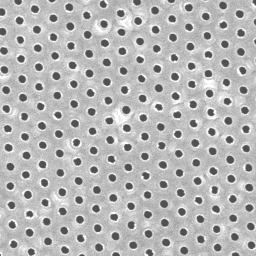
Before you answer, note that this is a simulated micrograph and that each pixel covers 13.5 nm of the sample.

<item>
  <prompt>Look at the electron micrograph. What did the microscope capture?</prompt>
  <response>a regular array of holes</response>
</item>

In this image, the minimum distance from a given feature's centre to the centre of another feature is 253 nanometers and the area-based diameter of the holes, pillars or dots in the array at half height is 107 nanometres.